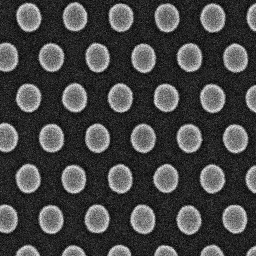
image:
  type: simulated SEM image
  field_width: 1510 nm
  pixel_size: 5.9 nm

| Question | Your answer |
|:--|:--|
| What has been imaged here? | a regular array of raised bodies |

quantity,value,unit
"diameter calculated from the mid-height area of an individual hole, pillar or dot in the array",154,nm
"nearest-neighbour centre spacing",0.271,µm